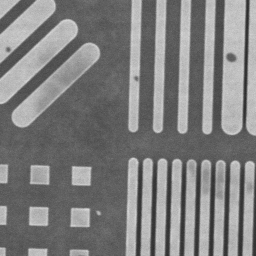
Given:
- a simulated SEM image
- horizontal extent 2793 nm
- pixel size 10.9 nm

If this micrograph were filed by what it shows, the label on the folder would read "groups of lines, slits or small figures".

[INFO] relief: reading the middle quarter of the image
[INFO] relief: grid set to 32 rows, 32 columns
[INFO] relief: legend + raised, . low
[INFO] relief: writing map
+++++++..........++....++....++.
++++++...........++....++....++.
+++++............++....++....++.
++++.............++....++....++.
++...............++....++....++.
+................++....++....++.
.................++....++....++.
.................++....++....++.
................++.....++....++.
................++.....++....++.
................++.....++....++.
................++.....++....++.
................++.....++....++.
................++.....++....++.
................++....++.....++.
................++....++.....++.
................++....++.....++.
................................
................................
................................
................................
................................
................................
................................
................++..++..++.++..+
................++..++.+++.++..+
..+++++.........++..++.+++.++..+
..++++..........++..++.+++.++..+
..++++..........++..++.+++.++..+
..++++..........++..++.+++.++..+
................++..++.+++.++..+
................++..++.+++.++..+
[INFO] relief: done